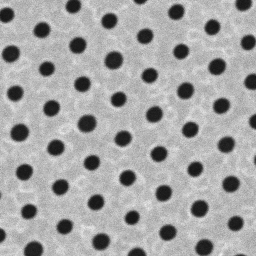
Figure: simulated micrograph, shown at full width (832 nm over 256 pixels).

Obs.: a regular array of holes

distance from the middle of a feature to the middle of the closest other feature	38.9	pixels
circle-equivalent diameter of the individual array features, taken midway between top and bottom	0.0519	micrometres